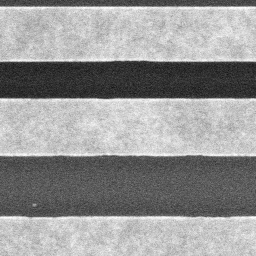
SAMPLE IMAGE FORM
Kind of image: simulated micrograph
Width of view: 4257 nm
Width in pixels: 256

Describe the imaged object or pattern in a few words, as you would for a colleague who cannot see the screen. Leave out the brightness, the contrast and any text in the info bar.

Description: lines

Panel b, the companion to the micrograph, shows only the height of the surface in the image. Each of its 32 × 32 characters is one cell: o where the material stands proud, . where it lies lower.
................................
oooooooooooooooooooooooooooooooo
oooooooooooooooooooooooooooooooo
oooooooooooooooooooooooooooooooo
oooooooooooooooooooooooooooooooo
oooooooooooooooooooooooooooooooo
oooooooooooooooooooooooooooooooo
oooooooooooooooooooooooooooooooo
................................
................................
................................
................................
oooooooooooooooooooooooooooooooo
oooooooooooooooooooooooooooooooo
oooooooooooooooooooooooooooooooo
oooooooooooooooooooooooooooooooo
oooooooooooooooooooooooooooooooo
oooooooooooooooooooooooooooooooo
oooooooooooooooooooooooooooooooo
................................
................................
................................
................................
................................
................................
................................
................................
oooooooooooooooooooooooooooooooo
oooooooooooooooooooooooooooooooo
oooooooooooooooooooooooooooooooo
oooooooooooooooooooooooooooooooo
oooooooooooooooooooooooooooooooo